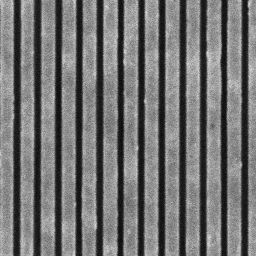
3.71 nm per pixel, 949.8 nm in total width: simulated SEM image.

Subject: parallel lines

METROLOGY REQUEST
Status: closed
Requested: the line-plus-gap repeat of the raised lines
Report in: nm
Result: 76.7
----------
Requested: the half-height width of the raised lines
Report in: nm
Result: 55.6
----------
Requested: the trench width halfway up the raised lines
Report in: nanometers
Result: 20.9